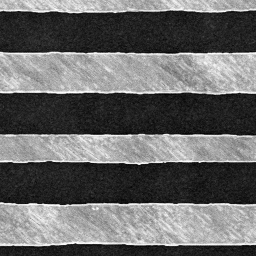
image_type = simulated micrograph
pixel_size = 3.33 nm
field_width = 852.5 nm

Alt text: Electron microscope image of lines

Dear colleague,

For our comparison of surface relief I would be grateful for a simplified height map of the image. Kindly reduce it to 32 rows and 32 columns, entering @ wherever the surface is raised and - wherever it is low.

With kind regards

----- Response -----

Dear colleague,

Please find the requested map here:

@@@@@@@@@@@@@@@@@@@@@@@@@@@@@@@@
--------@@----------------------
--------------------------------
--------------------------------
--------------------------------
--------------------------------
--------------------------------
@@@@@@@@@@@@@@@@@@@@@@@@@@@@@@@@
@@@@@@@@@@@@@@@@@@@@@@@@@@@@@@@@
@@@@@@@@@@@@@@@@@@@@@@@@@@@@@@@@
@@@@@@@@@@@@@@@@@@@@@@@@@@@@@@@@
@-----@@@---@@--@@@@--@-@@@@@-@@
--------------------------------
--------------------------------
--------------------------------
--------------------------------
--------------------------------
@@@@@@@@@@@@@@@@@@@@@@@@@@@@@@@@
@@@@@@@@@@@@@@@@@@@@@@@@@@@@@@@@
@@@@@@@@@@@@@@@@@@@@@@@@@@@@@@@@
--------------------------------
--------------------------------
--------------------------------
--------------------------------
--------------------------------
@@----------@@----@@-@-@---@@---
@@@@@@@@@@@@@@@@@@@@@@@@@@@@@@@@
@@@@@@@@@@@@@@@@@@@@@@@@@@@@@@@@
@@@@@@@@@@@@@@@@@@@@@@@@@@@@@@@@
@@@@@@@@@@@@@@@@@-@@@@@@@@@@@@@@
@@@@@@@@--------@@@@@@@@@@@@@@@@
--------------------------------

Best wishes